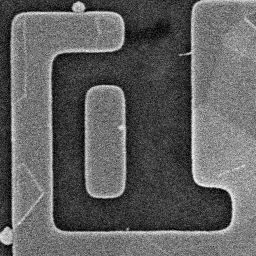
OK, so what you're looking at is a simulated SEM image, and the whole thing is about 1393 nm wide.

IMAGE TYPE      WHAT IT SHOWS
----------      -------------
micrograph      wiring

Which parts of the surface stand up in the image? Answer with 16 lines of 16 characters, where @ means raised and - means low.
------------@@@@
-@@@@@@@----@@@@
-@@@@@@@----@@@@
-@@@--------@@@@
-@@---------@@@@
-@@---@-----@@@@
-@@--@@@----@@@@
-@@--@@@----@@@@
-@@--@@@----@@@@
-@@--@@@----@@@@
-@@--@@@----@@@@
-@@--@@@-----@@@
-@@-----------@@
-@@-----------@@
@@@@@--@@@@@@@@@
-@@@@@@@@@@@@@@@